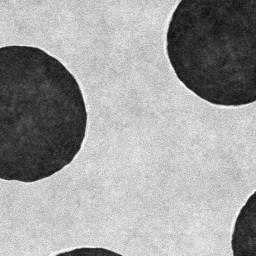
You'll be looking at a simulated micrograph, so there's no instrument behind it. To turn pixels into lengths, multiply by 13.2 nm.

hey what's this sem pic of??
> holes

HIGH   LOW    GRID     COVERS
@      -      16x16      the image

@@@@@@@@@@@-----
@@@@@@@@@@@-----
@@@@@@@@@@------
---@@@@@@@------
----@@@@@@@-----
-----@@@@@@@----
-----@@@@@@@@--@
-----@@@@@@@@@@@
-----@@@@@@@@@@@
-----@@@@@@@@@@@
----@@@@@@@@@@@@
@@@@@@@@@@@@@@@@
@@@@@@@@@@@@@@@-
@@@@@@@@@@@@@@@-
@@@@@@@@@@@@@@@-
@@@@@-@@@@@@@@--